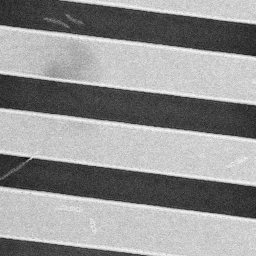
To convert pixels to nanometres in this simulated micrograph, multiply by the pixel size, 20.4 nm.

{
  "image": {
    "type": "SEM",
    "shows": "lines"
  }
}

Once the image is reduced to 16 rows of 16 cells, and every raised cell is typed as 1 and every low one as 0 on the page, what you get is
0000000011111111
0000000000000000
1111111000000000
1111111111111111
1111111111111111
0000000111111111
0000000000000000
1111110000000000
1111111111111100
1111111111111111
0000000111111111
0000000000000001
1111111000000000
1111111111111100
1111111111111111
0000011111111111